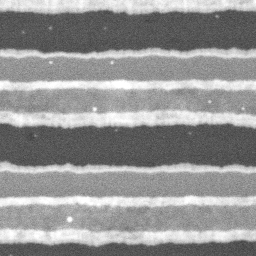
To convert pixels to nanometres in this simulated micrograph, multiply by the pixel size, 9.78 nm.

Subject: lines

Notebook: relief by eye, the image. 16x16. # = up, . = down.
.###...####.##..
................
................
################
################
################
################
################
................
................
................
################
################
################
################
................